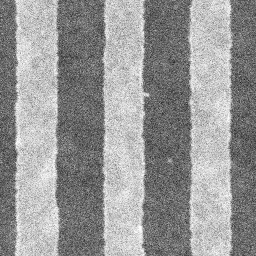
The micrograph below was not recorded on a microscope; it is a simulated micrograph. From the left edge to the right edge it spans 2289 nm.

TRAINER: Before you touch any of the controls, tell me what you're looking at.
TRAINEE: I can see one or a few lines or trenches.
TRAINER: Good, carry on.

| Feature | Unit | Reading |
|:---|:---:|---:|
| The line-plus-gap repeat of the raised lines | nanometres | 777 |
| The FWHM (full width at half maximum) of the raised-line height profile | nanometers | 341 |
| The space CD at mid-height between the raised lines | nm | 438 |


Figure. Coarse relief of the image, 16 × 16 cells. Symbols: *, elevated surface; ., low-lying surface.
.***...**...**..
.***...**...**..
.***...**...**..
.***...**...**..
.***...**...**..
.***...**...**..
.**....**...**..
.***...**...**..
.**....**...**..
.**....**...**..
.**....**...**..
.**....**...**..
.**....**...**..
.***...**...**..
.***...**...**..
.***...**...**..